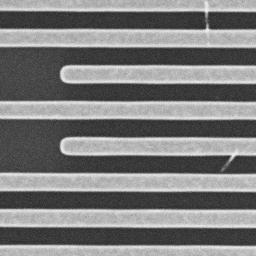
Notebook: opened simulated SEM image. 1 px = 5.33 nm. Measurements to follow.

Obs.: groups of lines, slits or small figures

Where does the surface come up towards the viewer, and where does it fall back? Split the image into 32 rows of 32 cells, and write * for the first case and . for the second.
********************************
................................
................................
................................
********************************
********************************
................................
................................
........************************
........************************
................................
................................
................................
********************************
********************************
................................
................................
........************************
........************************
................................
................................
................................
********************************
********************************
................................
................................
********************************
********************************
................................
................................
................................
********************************